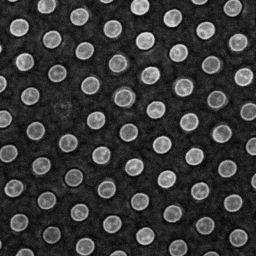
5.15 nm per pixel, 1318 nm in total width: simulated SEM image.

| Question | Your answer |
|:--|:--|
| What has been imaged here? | a regular array of raised bodies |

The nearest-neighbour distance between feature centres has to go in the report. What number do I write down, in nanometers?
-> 178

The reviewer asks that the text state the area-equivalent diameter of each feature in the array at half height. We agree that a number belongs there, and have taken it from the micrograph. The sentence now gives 86.2 nanometres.